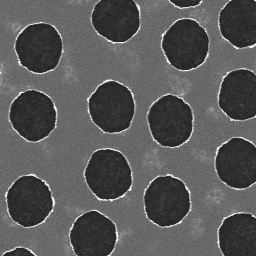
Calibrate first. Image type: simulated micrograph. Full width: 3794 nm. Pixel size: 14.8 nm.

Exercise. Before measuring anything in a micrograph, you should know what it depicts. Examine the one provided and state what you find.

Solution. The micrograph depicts a regular array of holes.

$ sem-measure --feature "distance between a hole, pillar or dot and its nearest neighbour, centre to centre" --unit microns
0.98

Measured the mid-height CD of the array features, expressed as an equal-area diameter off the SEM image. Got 0.71 micrometres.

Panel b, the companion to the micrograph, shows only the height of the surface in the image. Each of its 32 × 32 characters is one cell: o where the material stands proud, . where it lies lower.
oooooooooooo.....ooooo...ooo....
oooooooooooo.....ooooooooooo....
ooooooooooo......oooooo.ooo.....
ooo....ooooo.....oooo....ooo....
oo.....oooooo....oooo.....oo....
oo......oooooooooooo......ooo...
oo......ooooooooooooo.....oooooo
oo.....oooooooooooooo....ooooooo
ooo....ooooooooooooooo..oooooooo
oooooooooooooooooooooooooooo....
ooooooooooooo..ooooooooooooo....
ooo..ooooooo....ooooooooooo.....
oo....ooooo......ooo...oooo.....
o......oooo......oo.....oooo....
o......oooo......oo.....ooooo...
oo.....ooooo....ooo.....oooooooo
oo....ooooooo..oooo.....oooooooo
ooo..ooooooooooooooo...oooooo..o
oooooooooooooooooooooooooooo....
ooooooooooo....oooooooooooo.....
ooooooooooo.....ooooooooooo.....
ooooooooooo.....ooooooooooo.....
oo...oooooo.....ooo...oooooo....
o.....ooooo.....ooo....ooooooo.o
o.....oooooo...ooo......oooooooo
o......ooooooooooo......oooooooo
o.....ooooo.oooooo.....ooooooooo
oo...ooooo....ooooo....ooooo....
ooooooooo.....ooooooooooooo.....
ooooooooo......oooooooooooo.....
ooooooooo.....ooooooooooooo.....
o...ooooo.....oooooooooooooo....